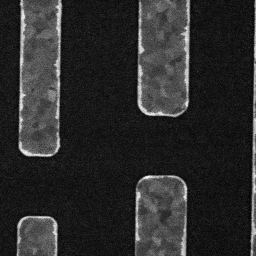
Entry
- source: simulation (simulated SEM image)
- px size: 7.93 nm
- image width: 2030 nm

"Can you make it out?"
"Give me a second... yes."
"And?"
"one or a few lines or trenches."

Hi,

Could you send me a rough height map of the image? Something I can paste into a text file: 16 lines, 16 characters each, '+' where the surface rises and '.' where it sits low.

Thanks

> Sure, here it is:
.+++.....+++....
.+++.....+++....
.+++.....+++....
.+++.....+++....
.+++.....+++....
.+++.....+++....
.+++.....+++....
.+++............
.+++............
.++.............
................
.........+++....
.........+++....
.........+++....
.+++....++++....
.+++....++++....